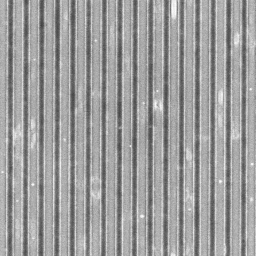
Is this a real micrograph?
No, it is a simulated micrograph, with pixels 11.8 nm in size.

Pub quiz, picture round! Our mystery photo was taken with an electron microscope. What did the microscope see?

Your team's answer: parallel lines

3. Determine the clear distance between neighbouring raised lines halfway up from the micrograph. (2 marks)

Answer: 8.13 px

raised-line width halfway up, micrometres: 0.0867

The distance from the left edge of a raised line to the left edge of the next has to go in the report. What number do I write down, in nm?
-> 183